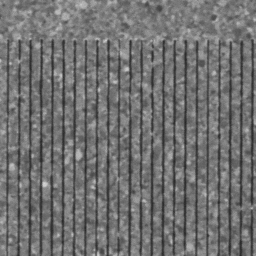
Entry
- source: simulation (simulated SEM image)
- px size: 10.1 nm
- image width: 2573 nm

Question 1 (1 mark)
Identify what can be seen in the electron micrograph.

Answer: parallel lines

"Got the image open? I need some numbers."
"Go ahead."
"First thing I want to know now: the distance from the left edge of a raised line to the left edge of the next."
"11.1 pixels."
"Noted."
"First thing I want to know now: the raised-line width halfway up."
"0.0854 µm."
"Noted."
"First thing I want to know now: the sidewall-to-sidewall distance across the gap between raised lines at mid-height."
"0.0251 um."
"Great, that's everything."